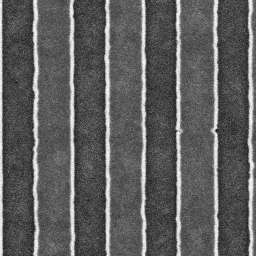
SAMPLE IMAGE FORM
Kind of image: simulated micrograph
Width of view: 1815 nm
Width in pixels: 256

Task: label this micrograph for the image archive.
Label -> one or a few lines or trenches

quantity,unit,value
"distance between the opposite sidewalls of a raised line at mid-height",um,0.263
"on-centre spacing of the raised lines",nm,508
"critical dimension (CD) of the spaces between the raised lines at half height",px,34.1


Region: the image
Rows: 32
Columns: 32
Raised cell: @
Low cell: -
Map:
----@@@@@----@@@@@----@@@@@----@
----@@@@@----@@@@@----@@@@@----@
----@@@@@----@@@@@----@@@@@----@
----@@@@@----@@@@@----@@@@@----@
----@@@@@----@@@@@----@@@@@----@
----@@@@@----@@@@@----@@@@@----@
----@@@@@----@@@@@----@@@@@----@
----@@@@@----@@@@@----@@@@@----@
-----@@@@----@@@@@----@@@@@----@
----@@@@@----@@@@@----@@@@@----@
----@@@@@----@@@@@----@@@@@----@
----@@@@@----@@@@@----@@@@@----@
----@@@@@----@@@@@----@@@@@----@
----@@@@@----@@@@@----@@@@@----@
----@@@@@----@@@@@----@@@@@----@
----@@@@@----@@@@@----@@@@@----@
----@@@@@----@@@@@----@@@@@----@
----@@@@@----@@@@@----@@@@@----@
----@@@@@----@@@@@----@@@@@----@
----@@@@@----@@@@@----@@@@@----@
----@@@@@----@@@@@----@@@@@----@
----@@@@@----@@@@@----@@@@@----@
----@@@@@----@@@@@----@@@@@----@
----@@@@@----@@@@@----@@@@@----@
----@@@@@----@@@@@----@@@@@----@
-----@@@@-----@@@@----@@@@@----@
-----@@@@----@@@@@----@@@@@----@
-----@@@@-----@@@@----@@@@@----@
-----@@@@----@@@@@----@@@@@----@
-----@@@@-----@@@@----@@@@@----@
-----@@@@----@@@@@----@@@@@----@
----@@@@@----@@@@@----@@@@@----@